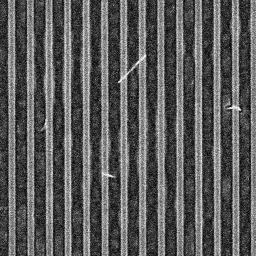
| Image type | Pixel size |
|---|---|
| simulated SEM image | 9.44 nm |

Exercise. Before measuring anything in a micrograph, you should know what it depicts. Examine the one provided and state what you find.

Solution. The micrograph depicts parallel lines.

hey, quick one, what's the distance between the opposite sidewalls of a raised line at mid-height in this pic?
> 56.6 nm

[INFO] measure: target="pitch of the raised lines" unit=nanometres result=176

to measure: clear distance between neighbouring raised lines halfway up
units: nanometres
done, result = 120